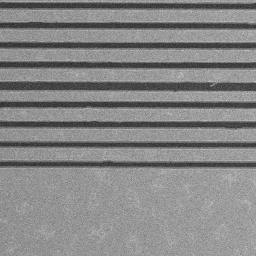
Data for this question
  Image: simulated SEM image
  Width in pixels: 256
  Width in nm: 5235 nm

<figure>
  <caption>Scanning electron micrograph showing parallel lines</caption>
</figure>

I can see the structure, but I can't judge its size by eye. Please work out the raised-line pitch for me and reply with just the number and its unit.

405 nanometres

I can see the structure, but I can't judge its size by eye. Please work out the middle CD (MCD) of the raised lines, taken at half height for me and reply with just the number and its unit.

243 nm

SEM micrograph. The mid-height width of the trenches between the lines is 0.161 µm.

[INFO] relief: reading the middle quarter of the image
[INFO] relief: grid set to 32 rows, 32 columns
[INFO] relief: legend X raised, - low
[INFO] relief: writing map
--------------------------------
XXXXXXXXXXXXX-----XXXXXXXX-XXXXX
XXXXXXXXXXXXXXXXXXXXXXXXXXXXXXXX
XXXXXXXXXXXXXXXXXXXXXXXXXXXXXXXX
--------------------------------
--------------------------------
--------------------------------
XXXXXXXXXXXXXXXXXXXXXXXXXXXXXXXX
XXXXXXXXXXXXXXXXXXXXXXXXXXXXXXXX
--------------------------------
--------------------------------
XXXXXXXXXXXXXXXXXXXXXXXXXXXXXXXX
XXXXXXXXXXXXXXXXXXXXXXXXXXXXXXXX
XXXXXXXXXXXXXXXXXXXXXXXXXXXXXXXX
--------------------------------
--------------------------------
XXXXXXXXXXXXXXXXXXXXXXXXXXXXXXXX
XXXXXXXXXXXXXXXXXXXXXXXXXXXXXXXX
XXXXXXXXXXXXXXXXXXXXXXXXXXXXXXXX
--------------------------------
--------------------------------
XXXXXXXXXXXXXXXXXXXXXXXXXXXXXXXX
XXXXXXXXXXXXXXXXXXXXXXXXXXXXXXXX
XXXXXXXXXXXXXXXXXXXXXXXXXXXXXXXX
--------------------------------
--------------------------------
XXXXXXXXXXXXXXXXXXXXXXXXXXXXXXXX
XXXXXXXXXXXXXXXXXXXXXXXXXXXXXXXX
XXXXXXXXXXXXXXXXXXXXXXXXXXXXXXXX
XXXXXXXXXXXXXXXXXXXXXXXXXXXXXXXX
XXXXXXXXXXXXXXXXXXXXXXXXXXXXXXXX
XXXXXXXXXXXXXXXXXXXXXXXXXXXXXXXX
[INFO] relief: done